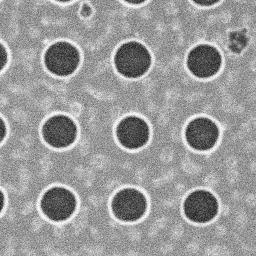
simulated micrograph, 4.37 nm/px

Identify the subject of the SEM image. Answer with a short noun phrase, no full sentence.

a regular array of holes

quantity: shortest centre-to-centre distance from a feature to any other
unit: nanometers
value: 310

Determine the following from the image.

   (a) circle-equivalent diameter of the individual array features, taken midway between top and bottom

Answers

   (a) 160 nm